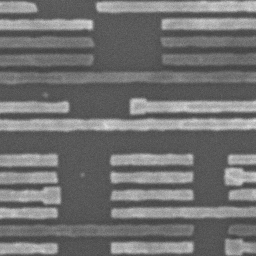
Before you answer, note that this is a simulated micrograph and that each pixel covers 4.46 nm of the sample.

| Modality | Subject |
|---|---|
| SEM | wiring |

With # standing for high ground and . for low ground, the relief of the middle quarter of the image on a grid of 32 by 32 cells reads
................................
................................
########.#######################
################################
#####....................#......
................................
................................
................................
................................
.................####...........
#................###############
#................###############
................................
................................
################################
################################
#...............................
................................
................................
................................
................................
................................
................................
............####################
............####################
................................
................................
............####################
............####################
............##....#############.
................................
................................